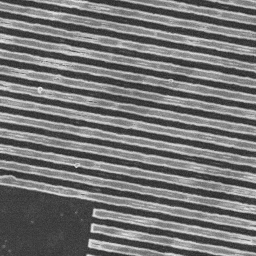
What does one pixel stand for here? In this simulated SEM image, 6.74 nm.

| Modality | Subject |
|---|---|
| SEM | parallel lines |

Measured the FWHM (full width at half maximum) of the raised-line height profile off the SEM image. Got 47.3 nm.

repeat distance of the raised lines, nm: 105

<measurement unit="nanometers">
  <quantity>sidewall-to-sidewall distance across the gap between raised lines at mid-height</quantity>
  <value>53.1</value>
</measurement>